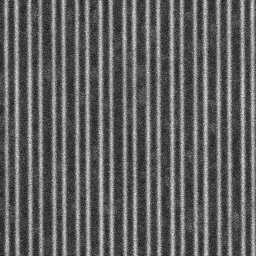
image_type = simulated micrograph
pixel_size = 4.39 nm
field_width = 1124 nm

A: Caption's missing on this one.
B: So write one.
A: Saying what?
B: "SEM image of parallel lines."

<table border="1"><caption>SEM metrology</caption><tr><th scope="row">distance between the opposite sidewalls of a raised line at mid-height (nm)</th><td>12.1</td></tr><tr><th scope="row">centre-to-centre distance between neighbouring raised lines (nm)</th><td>51.5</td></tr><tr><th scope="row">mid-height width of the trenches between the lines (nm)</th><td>35.7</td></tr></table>